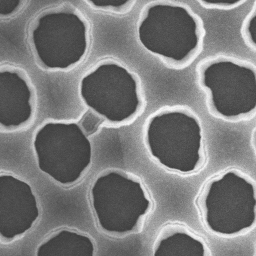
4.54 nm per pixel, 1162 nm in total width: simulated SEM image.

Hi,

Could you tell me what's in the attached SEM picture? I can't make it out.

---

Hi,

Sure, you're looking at holes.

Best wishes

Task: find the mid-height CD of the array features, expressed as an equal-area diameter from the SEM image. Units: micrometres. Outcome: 0.264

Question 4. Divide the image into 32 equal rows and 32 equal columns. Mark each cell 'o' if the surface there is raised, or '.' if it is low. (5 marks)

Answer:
...oooooooo.....ooo..oooooo..ooo
..oooo...ooooooooo......oooooooo
ooooo.....oooooooo......ooooooo.
oooo.......oooooo........oooooo.
oooo.......oooooo........oooooo.
oooo.......ooooooo.......ooooooo
ooooo......oooooooo.....oooooooo
ooooo.....ooooooooooo..oooo.oooo
oooooo..oooo...oooooooooo.......
...oooooooo......oooooooo.......
...ooooooo.......oooooooo.......
....oooooo.......ooooooooo......
....oooooo.......ooooooooo......
....ooooooo......ooooooooo......
....oooooo.......oo.....oooo..oo
...ooo.......oooooo......ooooooo
ooooo.......oooooo.......ooooooo
oooo.......ooooooo.......ooooooo
oooo.......oooooooo......ooooooo
ooooo......oooooooo......ooooooo
ooooo......ooooooooo.....ooooooo
oooooo....ooo..oooooooooooooo.oo
..ooooo...oo.....oooooooooo....o
....oooooooo......oooooooo......
....oooooooo......ooooooo.......
....oooooooo.......oooooo.......
.....ooooooo......oooooooo......
....oooooooo......oooooooo......
....ooooooooo....ooooooooo.....o
..ooooo...oooooooooo....oooooooo
ooooo.......ooooooo......ooooooo
ooooo.......ooooooo.......oooooo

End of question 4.